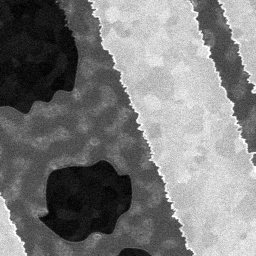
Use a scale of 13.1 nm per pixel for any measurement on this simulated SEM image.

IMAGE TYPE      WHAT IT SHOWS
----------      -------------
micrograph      one or a few lines or trenches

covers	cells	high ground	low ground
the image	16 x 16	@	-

@@@@--@@@@@@--@@
@@@@--@@@@@@--@@
@@@@@-@@@@@@@--@
@@@@@--@@@@@@--@
@@@@@--@@@@@@@-@
@@@@----@@@@@@--
@@------@@@@@@--
---------@@@@@@-
---------@@@@@@-
---------@@@@@@@
----@@@---@@@@@@
---@@@@@--@@@@@@
---@@@@@---@@@@@
@--@@@@@---@@@@@
@--@@@@----@@@@@
@-------@---@@@@